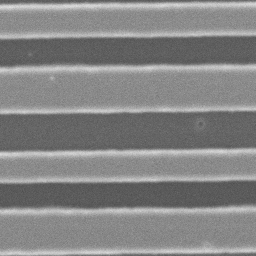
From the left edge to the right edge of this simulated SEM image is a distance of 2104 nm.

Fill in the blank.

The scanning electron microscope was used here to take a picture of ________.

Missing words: lines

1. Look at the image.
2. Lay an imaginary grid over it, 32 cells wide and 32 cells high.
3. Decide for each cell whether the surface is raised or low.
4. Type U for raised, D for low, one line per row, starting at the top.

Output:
DDDDDDDDDDDDDDDDDDDDDDDDUDUUUUUU
UUUUUUUUUUUUUUUUUUUUUUUUUUUUUUUU
UUUUUUUUUUUUUUUUUUUUUUUUUUUUUUUU
UUUUUUUUUUUUUUUUUUUUUUUUUUUUUUUU
UUUUUUUUUUUUUUUUUUUDDDDDDDDDDDDD
DDDDDDDDDDDDDDDDDDDDDDDDDDDDDDDD
DDDDDDDDDDDDDDDDDDDDDDDDDDDDDDDD
DDDDDDDDDDDDDDDDDDDDDDDDDDDDDDDD
DDDDDDDDDDDDDDUUDDUUUUUUUUUUUUUU
UUUUUUUUUUUUUUUUUUUUUUUUUUUUUUUU
UUUUUUUUUUUUUUUUUUUUUUUUUUUUUUUU
UUUUUUUUUUUUUUUUUUUUUUUUUUUUUUUU
UUUUUUUUUUUUUUUUUUUUUUUUUUUUUUUU
UUUUUUUUUUUUUUUUUUUUUUUUUUUUUUUU
DDDDDDDDDDDDDDDDDDDDDDDDDDDDDDDD
DDDDDDDDDDDDDDDDDDDDDDDDDDDDDDDD
DDDDDDDDDDDDDDDDDDDDDDDDDDDDDDDD
DDDDDDDDDDDDDDDDDDDDDDDDDDDDDDDD
DDDDDDDDDDDDDDDDDDDDDDDDDDDDDDDD
UUUUUUUUUUUUUUUUUUUUUUUUUUUUUUUU
UUUUUUUUUUUUUUUUUUUUUUUUUUUUUUUU
UUUUUUUUUUUUUUUUUUUUUUUUUUUUUUUU
UUUUUUUUUUUUUUUUUUUUDDDDDDDDDDDD
DDDDDDDDDDDDDDDDDDDDDDDDDDDDDDDD
DDDDDDDDDDDDDDDDDDDDDDDDDDDDDDDD
DDDDDDDDDDDDDDDDDDDDDDDDDDDDDDDD
UUUUUUUUUUUUUUUUUUUUUUUUUUUUUUUU
UUUUUUUUUUUUUUUUUUUUUUUUUUUUUUUU
UUUUUUUUUUUUUUUUUUUUUUUUUUUUUUUU
UUUUUUUUUUUUUUUUUUUUUUUUUUUUUUUU
UUUUUUUUUUUUUUUUUUUUUUUUUUUUUUUU
UUUUUUUUUUUUUUUUUUUUUUDUUUUDDDDD